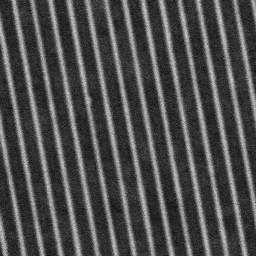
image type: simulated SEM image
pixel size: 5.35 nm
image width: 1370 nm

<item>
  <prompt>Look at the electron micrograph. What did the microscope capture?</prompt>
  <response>parallel lines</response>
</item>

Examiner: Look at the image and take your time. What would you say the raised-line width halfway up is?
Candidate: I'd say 21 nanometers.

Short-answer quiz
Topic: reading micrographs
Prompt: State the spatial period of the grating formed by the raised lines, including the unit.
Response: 96.9 nm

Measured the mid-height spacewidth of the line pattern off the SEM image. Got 73.6 nm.